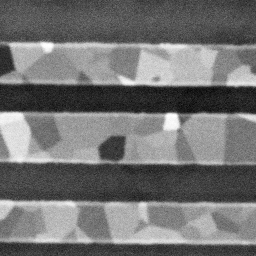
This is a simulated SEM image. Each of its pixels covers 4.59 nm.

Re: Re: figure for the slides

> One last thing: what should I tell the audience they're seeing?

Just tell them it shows lines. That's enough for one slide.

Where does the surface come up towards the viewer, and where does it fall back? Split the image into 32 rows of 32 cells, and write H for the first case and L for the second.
LLLLLLLLLLLLLLLLLLLLLLLLLLLLLLLL
LLLLLLLLLLLLLLLLLLLLLLLLLLLLLLLL
LLLLLLLLLLLLLLLLLLLLLLLLLLLLLLLL
LLLLLLLLLLLLLLLLLLLLLLLLLLLLLLLL
LLLLLLLLLLLLLLLLLLLLLLLLLLLLLLLL
HHHHHHHLLLLLLLLLLLLLLLLLLLLLLLLL
HHHHHHHHHHHHHHHHHHHHHHHHHHHHHHHH
HHHHHHHHHHHHHHHHHHHHHHHHHHHHHHHH
HHHHHHHHHHHHHHHHHHHHHHHHHHHHHHHH
HHHHHHHHHHHHHHHHHHHHHHHHHHHHHHHH
LLLLLLLLLHHHHHHHHHHHHHHHHHHHHHHH
LLLLLLLLLLLLLLLLLLLLLLLLLLLLLLLL
LLLLLLLLLLLLLLLLLLLLLLLLLLLLLLLL
LLLLLLLLLLLLLLLLLLLLLLLLLLLLLLLL
HHHHHHHHHHHHHHHHHHHHHHHHHHHHHHHH
HHHHHHHHHHHHHHHHHHHHHHHHHHHHHHHH
HHHHHHHHHHHHHHHHHHHHHHHHHHHHHHHH
HHHHHHHHHHHHHHHHHHHHHHHHHHHHHHHH
HHHHHHHHHHHHHHHHHHHHHHHHHHHHHHHH
HHHHHHHHHHHHHHHHHHHHHHHHHHHHHHHH
LLLLLLLLLLLLLLLLLLLLLHLLLHHHHHHH
LLLLLLLLLLLLLLLLLLLLLLLLLLLLLLLL
LLLLLLLLLLLLLLLLLLLLLLLLLLLLLLLL
LLLLLLLLLLLLLLLLLLLLLLLLLLLLLLLL
LLLLLLLLLLLLLLLLLLLLLLLLLLLLLLLL
HHHHHHHHHHHHHHHHHHHHHHHHHHHHHHHH
HHHHHHHHHHHHHHHHHHHHHHHHHHHHHHHH
HHHHHHHHHHHHHHHHHHHHHHHHHHHHHHHH
HHHHHHHHHHHHHHHHHHHHHHHHHHHHHHHH
HHHHHHHHHHHHHHHHHHHHHHHHHHHHHHHH
LLLLLLLLLLLLLLLLLLLLLLLLLLLLLLLL
LLLLLLLLLLLLLLLLLLLLLLLLLLLLLLLL